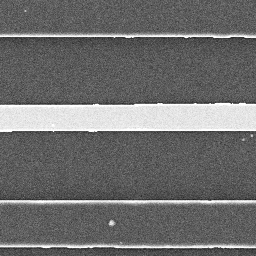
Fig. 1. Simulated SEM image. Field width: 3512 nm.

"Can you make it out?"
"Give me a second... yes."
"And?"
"lines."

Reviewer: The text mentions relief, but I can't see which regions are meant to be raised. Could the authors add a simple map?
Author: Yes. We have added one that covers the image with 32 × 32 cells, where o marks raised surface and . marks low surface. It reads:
oooooooooooooooooooooooooooooooo
oooooooooooooooooooooooooooooooo
oooooooooooooooooooooooooooooooo
oooooooooooooooooooooooooooooooo
oooooooooooooooooooooooooooooooo
................................
................................
................................
................................
................................
................................
................................
................................
................................
................................
................................
................................
................................
................................
................................
................................
................................
................................
................................
................................
oooooooooooooooooooooooooooooooo
oooooooooooooooooooooooooooooooo
oooooooooooooooooooooooooooooooo
oooooooooooooooooooooooooooooooo
oooooooooooooooooooooooooooooooo
oooooooooooooooooooooooooooooooo
................................